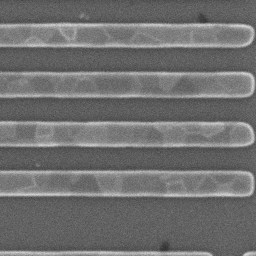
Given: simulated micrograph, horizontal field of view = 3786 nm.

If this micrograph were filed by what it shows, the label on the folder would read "wiring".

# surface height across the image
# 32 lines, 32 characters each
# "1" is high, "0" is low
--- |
00000000000000000000000000000000
00000000000000000000000000000000
00000000000000000000000000000000
11111111111111111111111111111110
11111111111111111111111111111111
11111111111111111111111111111110
00000000000000000000000000000000
00000000000000000000000000000000
00000000000000000000000000000000
11111111111111111111111111111110
11111111111111111111111111111111
11111111111111111111111111111111
00000000000000000000000000000000
00000000000000000000000000000000
00000000000000000000000000000000
11111111111111111111111111111110
11111111111111111111111111111111
11111111111111111111111111111111
00000000000000000000000000000000
00000000000000000000000000000000
00000000000000000000000000000000
11111111111111111111111111111110
11111111111111111111111111111111
11111111111111111111111111111111
00000000000000000000000000000000
00000000000000000000000000000000
00000000000000000000000000000000
00000000000000000000000000000000
00000000000000000000000000000000
00000000000000000000000000000000
00000000000000000000000000000000
00000000000000000000000000000000